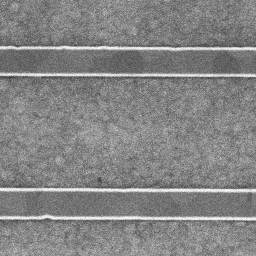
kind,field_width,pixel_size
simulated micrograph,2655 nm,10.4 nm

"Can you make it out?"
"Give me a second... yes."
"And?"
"one or a few lines or trenches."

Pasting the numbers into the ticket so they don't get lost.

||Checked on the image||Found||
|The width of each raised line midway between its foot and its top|286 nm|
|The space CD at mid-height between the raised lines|1200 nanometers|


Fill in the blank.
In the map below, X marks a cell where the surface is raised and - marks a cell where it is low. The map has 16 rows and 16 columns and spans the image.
----------------
----------------
----------------
XXXXXXXXXXXXXXXX
XXXXXXXXXXXXXXXX
----------------
----------------
----------------
----------------
----------------
----------------
----------------
XXXXXXXXXXXXXXXX
XXXXXXXXXXXXXXXX
----------------
----------------